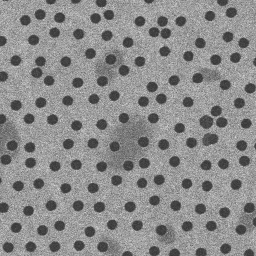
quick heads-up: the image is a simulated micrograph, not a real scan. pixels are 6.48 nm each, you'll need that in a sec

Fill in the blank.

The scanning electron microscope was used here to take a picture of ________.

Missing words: a regular array of holes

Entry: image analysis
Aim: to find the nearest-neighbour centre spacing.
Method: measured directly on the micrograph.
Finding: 130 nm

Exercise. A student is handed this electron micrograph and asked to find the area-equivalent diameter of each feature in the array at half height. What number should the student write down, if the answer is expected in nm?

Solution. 69.7